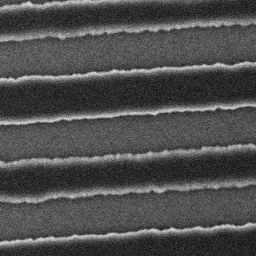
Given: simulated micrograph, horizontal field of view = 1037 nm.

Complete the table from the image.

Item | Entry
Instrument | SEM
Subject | lines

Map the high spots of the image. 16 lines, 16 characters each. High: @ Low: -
@@@@@@@@@@@@@@@@
@@@@@@@@@@@@@@--
----------------
----------------
-------@@@@@@@@@
@@@@@@@@@@@@@@@@
@@@@@@@@@@@@@@@@
@@@@------------
----------------
-----------@@@@@
@@@@@@@@@@@@@@@@
@@@@@@@@@@@@@@@-
@@@-------------
----------------
--------@@@@@@@@
@@@@@@@@@@@@@@@@